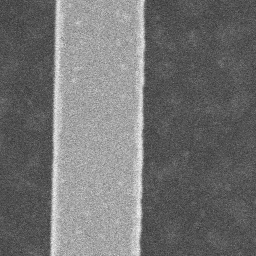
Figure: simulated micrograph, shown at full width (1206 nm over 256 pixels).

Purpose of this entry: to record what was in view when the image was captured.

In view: one or a few lines or trenches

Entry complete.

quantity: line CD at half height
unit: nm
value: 397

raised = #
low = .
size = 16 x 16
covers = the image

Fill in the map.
....#####.......
....#####.......
....#####.......
....#####.......
....#####.......
....#####.......
....#####.......
....#####.......
....#####.......
...######.......
...######.......
...######.......
...######.......
...######.......
...######.......
...######.......